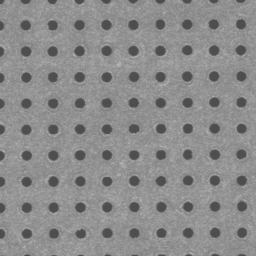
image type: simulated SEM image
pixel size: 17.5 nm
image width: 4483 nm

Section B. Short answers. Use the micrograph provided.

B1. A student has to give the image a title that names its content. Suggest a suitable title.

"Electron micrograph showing a regular array of holes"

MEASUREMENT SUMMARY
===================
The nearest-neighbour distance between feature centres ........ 453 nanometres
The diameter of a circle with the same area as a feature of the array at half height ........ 186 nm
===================